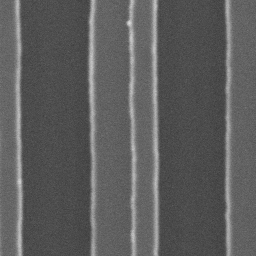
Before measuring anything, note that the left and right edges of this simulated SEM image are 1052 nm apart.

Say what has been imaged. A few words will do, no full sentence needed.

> lines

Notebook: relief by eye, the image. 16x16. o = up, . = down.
o.....oooo....oo
o.....oooo....oo
o.....oooo....oo
o.....oooo....oo
o.....oooo....oo
o.....oooo....oo
o.....oooo....oo
o.....oooo....oo
o.....oooo....oo
o.....oooo....oo
o.....oooo....oo
o.....oooo....oo
o.....oooo....oo
o.....oooo....oo
o.....oooo....oo
o.....oooo....oo